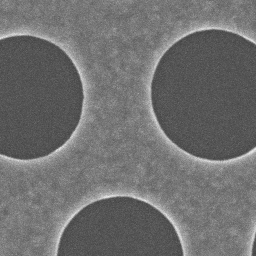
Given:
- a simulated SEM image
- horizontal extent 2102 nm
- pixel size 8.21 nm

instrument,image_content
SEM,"holes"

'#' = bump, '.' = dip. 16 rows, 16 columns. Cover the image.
################
################
...########.....
....######......
.....#####......
.....####.......
.....####.......
.....#####......
....######......
...#########....
################
################
######...#######
#####.....######
####.......#####
####.......#####